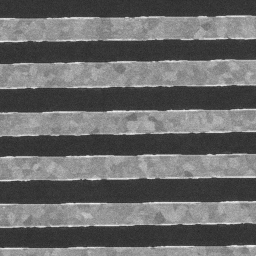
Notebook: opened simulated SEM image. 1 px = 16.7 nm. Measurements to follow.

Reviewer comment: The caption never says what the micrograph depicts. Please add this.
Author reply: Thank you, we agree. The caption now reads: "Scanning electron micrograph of lines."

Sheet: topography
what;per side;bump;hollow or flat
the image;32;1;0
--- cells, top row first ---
00000000000000000000000000000000
00000000000000000000000000000000
11111111111111111111111111111111
11111111111111111111111111111111
11111111111111111111111111111111
00000000000000000000000000000000
00000000000000000000000000000000
00000000000000000000000000000000
11111111111111111111111111111111
11111111111111111111111111111111
11111111111111111111111111111111
00000000000000000000000000000000
00000000000000000000000000000000
00000000000000000000000000000000
11111111111111111111111111111111
11111111111111111111111111111111
11111111111111111111111110000000
00000000000000000000000000000000
00000000000000000000000000000000
00000000000000000111111111111111
11111111111111111111111111111111
11111111111111111111111111111111
11110000000000000000000000000000
00000000000000000000000000000000
00000000000000000000000000000000
00000000000000000011111111111111
11111111111111111111111111111111
11111111111111111111111111111111
00000000000000000000000000000000
00000000000000000000000000000000
00000000000000000000000000000000
11111111111111111111111111111111